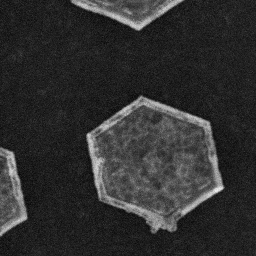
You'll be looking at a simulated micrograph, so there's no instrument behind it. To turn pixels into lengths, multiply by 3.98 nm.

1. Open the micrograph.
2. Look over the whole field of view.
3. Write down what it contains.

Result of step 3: raised bodies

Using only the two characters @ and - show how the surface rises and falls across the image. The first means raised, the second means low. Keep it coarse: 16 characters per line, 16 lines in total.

------@@@@------
--------@-------
----------------
----------------
----------------
----------------
--------@@------
-------@@@@@----
------@@@@@@@---
------@@@@@@@---
@-----@@@@@@@@--
@-----@@@@@@@@--
@------@@@@@@---
@--------@@-----
----------------
----------------